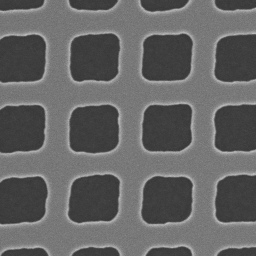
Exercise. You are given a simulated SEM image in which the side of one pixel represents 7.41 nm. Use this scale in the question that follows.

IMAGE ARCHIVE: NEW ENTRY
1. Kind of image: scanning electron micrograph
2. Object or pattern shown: holes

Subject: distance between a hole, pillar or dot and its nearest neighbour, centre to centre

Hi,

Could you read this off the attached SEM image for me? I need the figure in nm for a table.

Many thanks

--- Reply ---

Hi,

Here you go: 522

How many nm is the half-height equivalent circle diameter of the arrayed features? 392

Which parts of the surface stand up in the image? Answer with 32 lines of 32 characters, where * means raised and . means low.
.....****.....****.....****.....
********************************
********************************
********************************
*....*****.....****.....****....
......***......***......***.....
......***......***......***.....
......***......***......***.....
......***......***......***.....
.....****......***.....****.....
********************************
********************************
********************************
.....*****....****......****....
......***......***......***.....
......***......***......***.....
......***......***......***.....
......***......***......***.....
.....****.....****.....****.....
********************************
********************************
********************************
.....****......****.....****....
......***......***......***.....
......***......***......***.....
......***......***......***.....
......**.......***......***.....
.....****.....****.....****.....
********************************
********************************
********************************
......***......***......***.....